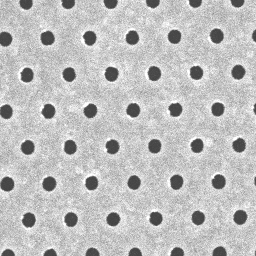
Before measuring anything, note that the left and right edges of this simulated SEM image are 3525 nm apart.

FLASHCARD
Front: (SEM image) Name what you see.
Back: a regular array of holes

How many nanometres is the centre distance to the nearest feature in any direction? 574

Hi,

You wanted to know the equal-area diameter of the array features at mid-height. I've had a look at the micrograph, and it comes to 201 nanometers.